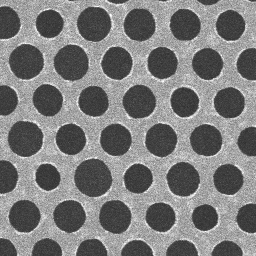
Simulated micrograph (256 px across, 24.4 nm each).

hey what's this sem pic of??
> a regular array of holes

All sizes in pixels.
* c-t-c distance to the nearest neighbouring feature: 44.3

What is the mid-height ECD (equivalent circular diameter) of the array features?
786 nanometres